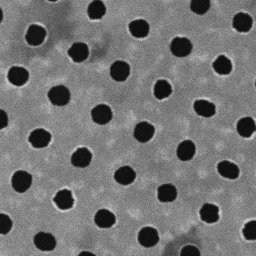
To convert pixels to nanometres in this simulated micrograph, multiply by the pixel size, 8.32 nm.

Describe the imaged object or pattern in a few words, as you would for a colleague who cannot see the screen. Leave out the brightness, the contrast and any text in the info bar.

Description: a regular array of holes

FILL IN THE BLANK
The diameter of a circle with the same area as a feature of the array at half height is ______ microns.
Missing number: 0.173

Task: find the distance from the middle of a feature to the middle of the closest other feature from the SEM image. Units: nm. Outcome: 381